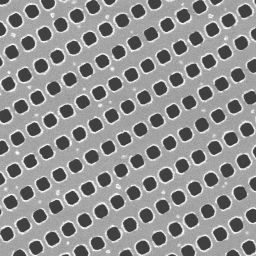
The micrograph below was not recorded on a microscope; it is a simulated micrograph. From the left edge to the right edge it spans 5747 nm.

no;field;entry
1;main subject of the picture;a regular array of holes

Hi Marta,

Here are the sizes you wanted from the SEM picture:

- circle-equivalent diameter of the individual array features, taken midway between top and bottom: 308 nanometers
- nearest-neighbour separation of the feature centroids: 416 nanometers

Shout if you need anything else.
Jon